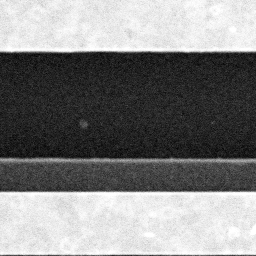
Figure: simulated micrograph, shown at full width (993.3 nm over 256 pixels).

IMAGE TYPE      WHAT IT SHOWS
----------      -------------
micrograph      lines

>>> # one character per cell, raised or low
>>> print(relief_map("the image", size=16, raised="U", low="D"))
UUUUUUUUUUUUUUUU
UUUUUUUUUUUUUUUU
UUUUUUUUUUUUUUUU
DDDDDDDDDDDDDDDD
DDDDDDDDDDDDDDDD
DDDDDDDDDDDDDDDD
DDDDDDDDDDDDDDDD
DDDDDDDDDDDDDDDD
DDDDDDDDDDDDDDDD
DDDDDDDDDDDDDDDD
UUUUUUUUUUUUUUUU
UUUUUUUUUUUUUUUU
UUUUUUUUUUUUUUUU
UUUUUUUUUUUUUUUU
UUUUUUUUUUUUUUUU
UUUUUUUUUUUUUUUU